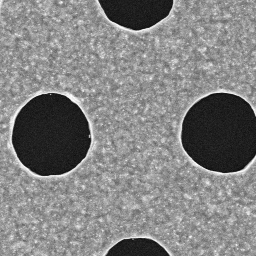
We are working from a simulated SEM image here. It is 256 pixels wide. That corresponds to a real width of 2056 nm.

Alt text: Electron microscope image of holes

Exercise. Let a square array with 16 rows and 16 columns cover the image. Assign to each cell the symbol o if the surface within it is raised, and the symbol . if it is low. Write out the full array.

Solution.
oooooo.....ooooo
ooooooo...oooooo
oooooooooooooooo
oooooooooooooooo
oooooooooooooooo
oooooooooooooooo
oo...ooooooo...o
o....oooooo.....
o.....ooooo.....
o....ooooooo....
oo...oooooooo..o
oooooooooooooooo
oooooooooooooooo
oooooooooooooooo
oooooooooooooooo
ooooooo...oooooo